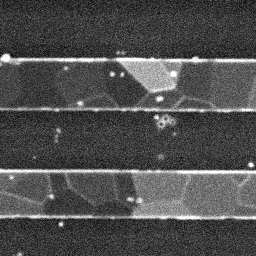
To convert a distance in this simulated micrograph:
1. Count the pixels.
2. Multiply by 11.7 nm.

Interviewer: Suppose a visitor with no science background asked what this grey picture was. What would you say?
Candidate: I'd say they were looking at lines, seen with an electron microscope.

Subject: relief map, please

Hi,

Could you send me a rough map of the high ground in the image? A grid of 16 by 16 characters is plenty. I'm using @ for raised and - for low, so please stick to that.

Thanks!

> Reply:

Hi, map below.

----------------
----------------
----------------
----------------
@@@@@@@@@@@@@@@@
@@@@@@@@@@@@@@@@
@@@@@@@@@@@@@@@@
----------------
----------------
----------------
----------------
@@@@@@@@@@@@@@@@
@@@@@@@@@@@@@@@@
@@@@@@@@@@@@@@@@
----------------
----------------